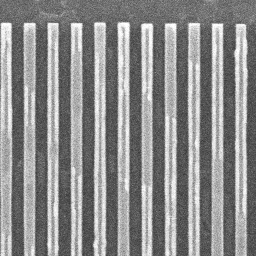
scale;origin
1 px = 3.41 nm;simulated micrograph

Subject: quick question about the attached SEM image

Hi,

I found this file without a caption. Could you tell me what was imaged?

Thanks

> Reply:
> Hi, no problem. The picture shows parallel lines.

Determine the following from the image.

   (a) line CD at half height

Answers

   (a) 10.3 px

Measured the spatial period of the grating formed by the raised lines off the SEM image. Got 80 nm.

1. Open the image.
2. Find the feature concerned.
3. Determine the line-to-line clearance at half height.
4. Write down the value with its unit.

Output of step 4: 44.8 nm